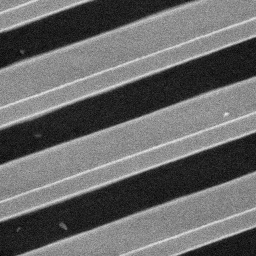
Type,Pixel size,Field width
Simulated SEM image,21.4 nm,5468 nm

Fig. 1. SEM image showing lines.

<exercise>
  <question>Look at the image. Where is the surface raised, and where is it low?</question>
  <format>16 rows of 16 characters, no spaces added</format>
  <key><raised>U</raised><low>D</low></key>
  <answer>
UUUUDDDDDDDUUUUU
UDDDDDDDUUUUUUUU
DDDDDUUUUUUUUUUD
DDDUUUUUUUUUUDDD
UUUUUUUUUUDDDDDD
UUUUUUUDDDDDDDUU
UUUUDDDDDDDUUUUU
UDDDDDDDUUUUUUUU
DDDDDUUUUUUUUUUD
DDDUUUUUUUUUDDDD
UUUUUUUUUDDDDDDD
UUUUUUUDDDDDDDUU
UUUUDDDDDDDUUUUU
UDDDDDDDUUUUUUUU
DDDDDUUUUUUUUUUD
DDDUUUUUUUUUDDDD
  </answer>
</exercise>